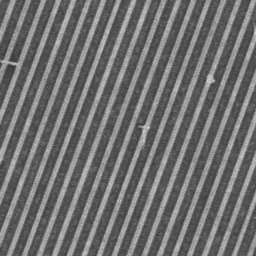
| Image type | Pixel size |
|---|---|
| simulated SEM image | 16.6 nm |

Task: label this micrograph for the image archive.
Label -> parallel lines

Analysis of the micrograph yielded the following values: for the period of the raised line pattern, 233 nanometres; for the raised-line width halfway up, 62.2 nm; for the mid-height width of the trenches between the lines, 169 nanometers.